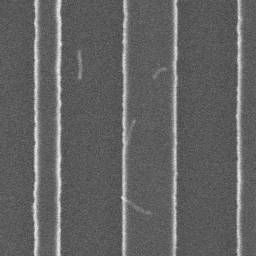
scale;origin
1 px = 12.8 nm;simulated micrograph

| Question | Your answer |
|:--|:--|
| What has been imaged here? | lines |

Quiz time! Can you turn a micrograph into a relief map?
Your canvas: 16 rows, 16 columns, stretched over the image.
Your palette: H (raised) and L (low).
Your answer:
LLHHLLLLHHHLLLLH
LLHHLLLLHHHLLLLH
LLHHLLLLHHHLLLLH
LLHHLLLLHHHLLLLH
LLHHLLLLHHHLLLLH
LLHHLLLLHHHLLLLH
LLHHLLLLHHHLLLLH
LLHHLLLLHHHLLLLH
LLHHLLLLHHHLLLLH
LLHHLLLLHHHLLLLH
LLHHLLLLHHHLLLLH
LLHHLLLLHHHLLLLH
LLHHLLLLHHHLLLLH
LLHHLLLLHHHLLLLH
LLHHLLLLHHHLLLLH
LLHHLLLLHHHLLLLH